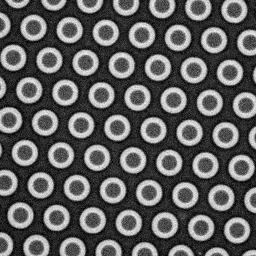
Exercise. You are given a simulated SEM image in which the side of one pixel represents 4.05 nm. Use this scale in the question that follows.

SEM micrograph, an array of small figures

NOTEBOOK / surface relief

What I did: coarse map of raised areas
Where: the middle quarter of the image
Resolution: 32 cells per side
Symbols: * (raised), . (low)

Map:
..******...*******..*******..***
...*****...******...*******..***
....***.....*****....*****...***
......................***.....**
**.............................*
***....*****.....***............
***....*****....*****....****...
***...*******..******....*****..
***...*******..******...*******.
**.....*****...******...*******.
........***.....*****....*****..
..................*......****...
...***..........................
..*****....****......**.........
.******...******....*****.....**
.******...******...******....***
.******...******...*******..****
..*****....*****...******...****
...........****.....*****...****
.....................***.....***
*......***......................
**....*****....****.............
**...******....*****....*****...
**...******...******...******...
**...******...******...******...
*.....*****...******...******...
.......**......****.....*****...
.........................***....
.****......**...................
******....*****.....***.........
******...******....*****....****
******...******...******...*****